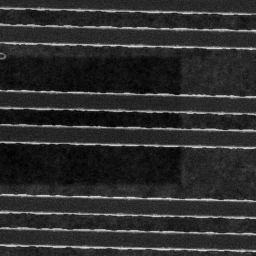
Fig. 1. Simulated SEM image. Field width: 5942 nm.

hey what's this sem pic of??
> lines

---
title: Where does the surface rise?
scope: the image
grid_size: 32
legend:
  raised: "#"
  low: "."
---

################################
..................##############
................................
###############.................
################################
......##########################
................................
................................
................................
................................
................................
####............................
################################
################################
................................
................................
################################
################################
................................
................................
................................
................................
................................
................................
####............................
################################
################################
................................
................................
################################
################################
................................